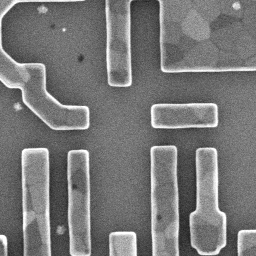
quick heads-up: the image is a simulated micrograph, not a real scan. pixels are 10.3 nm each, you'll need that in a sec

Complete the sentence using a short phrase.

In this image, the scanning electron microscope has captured wiring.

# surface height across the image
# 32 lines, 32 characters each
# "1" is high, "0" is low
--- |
11000000000001110000111111111111
10000000000001110000111111111111
00000000000001110000111111111111
00000000000001110000111111111111
00000000000001110000111111111111
00000000000001110000111111111111
10000000000001110000111111111111
11000000000001110000111111111111
11111100000001110000111111111111
11111100000001110000000000000000
01111100000000110000000000000000
00011100000000000000000000000000
00011110000000000000000000000000
00001111111000000001111111100000
00000111111000000001111111100000
00000011111000000001111111100000
00000000000000000000000000000000
00000000000000000000000000000000
00000000000000000001110000000000
00011100111000000001110001100000
00011100111000000001110001100000
00011100111000000001110001100000
00011100111000000001110001100000
00011100011000000001110001100000
00011100011000000001110001100000
00011100011000000001110001100000
00011100011000000001110011110000
00011100011000000001110011110000
00011100011000000001110011110000
00011100011000111001110011110011
10011100011000111001110011110011
10011100011000111001110001100011